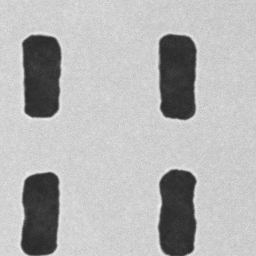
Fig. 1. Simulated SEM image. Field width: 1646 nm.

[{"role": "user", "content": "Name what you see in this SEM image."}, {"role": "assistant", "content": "holes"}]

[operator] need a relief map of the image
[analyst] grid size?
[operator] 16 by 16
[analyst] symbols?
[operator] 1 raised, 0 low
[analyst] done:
1111111111111111
1111111111111111
1101111111001111
1000111111001111
1000111111001111
1000111111001111
1100111111001111
1111111111111111
1111111111111111
1111111111111111
1111111111111111
1100111111001111
1000111111001111
1000111111001111
1000111111001111
1001111111001111